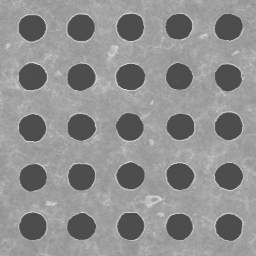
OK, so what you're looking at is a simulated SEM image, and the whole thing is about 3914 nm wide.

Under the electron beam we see a regular array of holes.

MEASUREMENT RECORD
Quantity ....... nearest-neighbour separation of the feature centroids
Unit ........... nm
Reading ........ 744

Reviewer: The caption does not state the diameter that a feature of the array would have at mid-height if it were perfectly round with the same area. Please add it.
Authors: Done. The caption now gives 418 nm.